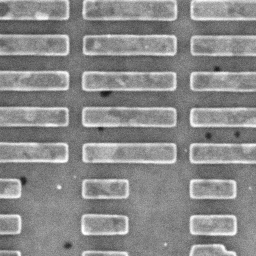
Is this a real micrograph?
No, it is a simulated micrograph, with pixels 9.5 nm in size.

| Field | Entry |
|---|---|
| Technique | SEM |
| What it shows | wiring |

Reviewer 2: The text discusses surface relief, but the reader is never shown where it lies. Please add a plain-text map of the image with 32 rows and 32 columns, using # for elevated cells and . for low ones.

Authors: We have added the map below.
########...###########..########
########..############..########
...................###..........
................................
########....#####..##...........
########...###########..########
########...###########..########
................................
................................
########..############..########
########..############..########
................................
................................
#####......#####................
########..############..########
########...###########..########
................................
................................
########..############..########
########..############..########
................................
................................
#...............................
###.......######........#####...
##.........#####........#####...
................................
................................
###.......######........#####...
###.......######........#####...
................................
................................
##.........##...........#####...